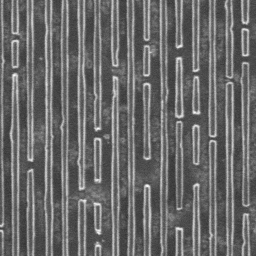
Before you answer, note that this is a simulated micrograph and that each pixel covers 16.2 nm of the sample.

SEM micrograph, parallel lines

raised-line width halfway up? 93.2 nanometers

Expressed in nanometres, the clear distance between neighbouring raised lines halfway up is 172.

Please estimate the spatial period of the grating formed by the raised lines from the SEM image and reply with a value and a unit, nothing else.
267 nanometres